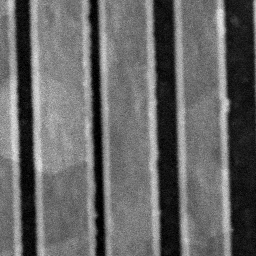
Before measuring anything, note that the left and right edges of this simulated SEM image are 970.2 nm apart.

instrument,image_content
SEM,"one or a few lines or trenches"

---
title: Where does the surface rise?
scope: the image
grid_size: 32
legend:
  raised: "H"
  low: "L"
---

HLLLHHHHHHHLLHHHHHHLLLHHHHHLLLLL
HLLLHHHHHHHLLHHHHHHLLLHHHHHLLLLL
HLLLHHHHHHHLLHHHHHHLLLHHHHHLLLLL
HLLLHHHHHHHLLHHHHHHLLLHHHHHHLLLL
HHLLHHHHHHHLLHHHHHHLLLHHHHHHLLLL
HHLLHHHHHHHLLHHHHHHLLLHHHHHHLLLL
HHLLHHHHHHHLLHHHHHHLLLHHHHHHLLLL
HLLLHHHHHHHLLHHHHHHLLLHHHHHHLLLL
HHLLHHHHHHHLLHHHHHHLLLLHHHHHLLLL
HHLLLHHHHHHLLHHHHHHLLLLHHHHHLLLL
HHLLLHHHHHHLLHHHHHHLLLLHHHHHLLLL
HHLLHHHHHHHLLHHHHHHLLLLHHHHHLLLL
HHLLLHHHHHHLLHHHHHHLLLLHHHHHLLLL
HHLLLHHHHHHLLHHHHHHLLLLHHHHHLLLL
HHLLLHHHHHHLLHHHHHHLLLLHHHHHLLLL
HHLLLHHHHHHLLHHHHHHLLLLHHHHHLLLL
HHLLLHHHHHHLLHHHHHHLLLLHHHHHLLLL
HHLLLHHHHHHLLHHHHHHLLLLHHHHHLLLL
HHLLLHHHHHHLLHHHHHHLLLLHHHHHLLLL
HHLLLHHHHHHLLHHHHHHLLLLHHHHHLLLL
HHLLLHHHHHHLLHHHHHHLLLLHHHHHLLLL
HHLLLHHHHHHLLHHHHHHLLLLHHHHHLLLL
HHLLLHHHHHHLLHHHHHHLLLLHHHHHLLLL
HHLLLHHHHHHLLHHHHHHLLLLHHHHHLLLL
HHLLLHHHHHHLLHHHHHHLLLLHHHHHLLLL
HHLLLHHHHHHLLHHHHHHLLLLHHHHHLLLL
HHLLLHHHHHHLLLHHHHHLLLLHHHHHLLLL
HHLLLHHHHHHLLLHHHHHLLLLHHHHHLLLL
HHLLLHHHHHHHLLHHHHHLLLLHHHHHLLLL
HHLLLHHHHHHLLLHHHHHLLLLHHHHHLLLL
HHLLLHHHHHHHLLHHHHHHLLLHHHHHLLLL
HHLLLHHHHHHHLLHHHHHHLLLHHHHHLLLL